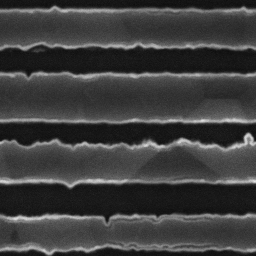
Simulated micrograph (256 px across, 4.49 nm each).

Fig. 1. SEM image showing one or a few lines or trenches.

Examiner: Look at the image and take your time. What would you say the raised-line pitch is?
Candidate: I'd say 0.306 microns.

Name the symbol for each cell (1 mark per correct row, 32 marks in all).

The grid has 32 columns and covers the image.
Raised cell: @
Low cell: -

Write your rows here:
--------------------------------
@@@@@@@@@@@@@@@@@@@@@@@@@@@@@@@@
@@@@@@@@@@@@@@@@@@@@@@@@@@@@@@@@
@@@@@@@@@@@@@@@@@@@@@@@@@@@@@@@@
@@@@@@@@@@@@@@@@@@@@@@@@@@@@@@@@
@@@@@@@@@@@@@@@@@@@@@@@@@@@@@@@@
--------------------------------
--------------------------------
--------------------------------
@@@-@@@@@@@@@@@@@@@@@@@@@@@@@@@@
@@@@@@@@@@@@@@@@@@@@@@@@@@@@@@@@
@@@@@@@@@@@@@@@@@@@@@@@@@@@@@@@@
@@@@@@@@@@@@@@@@@@@@@@@@@@@@@@@@
@@@@@@@@@@@@@@@@@@@@@@@@@@@@@@@@
@@@@@@@@@@@@@@@@@@@@@@@@@@@@@@@@
--------------------------------
--------------------------------
-------------------------------@
@@@@@@@@@@@@@@@@@@@@@@@@@@@@-@@@
@@@@@@@@@@@@@@@@@@@@@@@@@@@@@@@@
@@@@@@@@@@@@@@@@@@@@@@@@@@@@@@@@
@@@@@@@@@@@@@@@@@@@@@@@@@@@@@@@@
@@@@@@@@@@@@@@@@@@@@@@@@@@@@@@@@
--------------------------------
--------------------------------
--------------------------------
--------------------------------
@@@@@@@@@@@@@@@@@@@@@@@@@@@@@@@@
@@@@@@@@@@@@@@@@@@@@@@@@@@@@@@@@
@@@@@@@@@@@@@@@@@@@@@@@@@@@@@@@@
@@@@@@@@@@@@@@@@@@@@@@@@@@@@@@@@
-----@@-------------------------